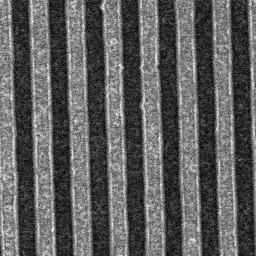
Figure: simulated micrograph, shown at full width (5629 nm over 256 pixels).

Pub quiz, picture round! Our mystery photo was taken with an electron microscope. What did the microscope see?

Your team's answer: parallel lines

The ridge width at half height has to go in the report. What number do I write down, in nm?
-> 371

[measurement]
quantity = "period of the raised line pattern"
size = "802 nm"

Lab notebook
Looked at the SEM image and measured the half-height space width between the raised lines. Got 426 nanometers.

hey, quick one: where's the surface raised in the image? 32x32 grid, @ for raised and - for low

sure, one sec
@---@@--@@---@@--@@@--@@---@@--@
@---@@--@@---@@--@@@--@@---@@--@
@---@@--@@---@@---@@--@@---@@--@
@---@@--@@@--@@---@@--@@---@@--@
@---@@---@@--@@---@@--@@---@@--@
@---@@---@@--@@---@@--@@---@@--@
@---@@---@@--@@---@@--@@---@@--@
@@--@@---@@--@@---@@--@@---@@--@
@---@@---@@--@@---@@--@@---@@--@
@@--@@---@@--@@---@@--@@---@@---
@@--@@---@@--@@---@@--@@---@@---
@@--@@---@@--@@---@@--@@---@@--@
@@--@@---@@--@@---@@--@@---@@--@
@@--@@---@@--@@---@@--@@@--@@---
@@--@@---@@--@@---@@--@@@--@@---
@@--@@---@@--@@---@@---@@--@@---
@@--@@---@@---@---@@---@@--@@---
@@--@@---@@---@---@@---@@--@@---
@@--@@---@@---@---@@---@@--@@---
@@--@@---@@---@@--@@---@@--@@---
@@--@@---@@---@@--@@---@@--@@---
@@--@@@--@@---@@--@@---@@--@@---
@@---@@--@@---@@--@@---@@--@@---
@@--@@@--@@---@@--@@---@@--@@---
@@--@@@--@@---@@--@@---@@--@@---
@@---@@--@@---@@--@@---@@--@@---
@@---@@--@@---@@--@@---@@--@@---
@@---@@--@@---@@--@@---@@--@@---
@@---@@--@@---@@--@@---@@--@@---
@@---@@--@@---@@--@@---@@--@@---
@@---@@--@@---@@--@@@--@@---@@--
@@---@@--@@---@@--@@---@@---@@--